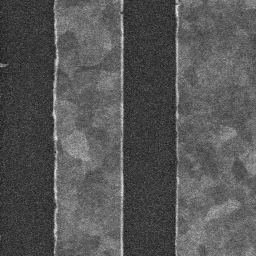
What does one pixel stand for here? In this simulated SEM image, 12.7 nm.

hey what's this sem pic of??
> one or a few lines or trenches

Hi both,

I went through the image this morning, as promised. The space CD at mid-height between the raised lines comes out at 707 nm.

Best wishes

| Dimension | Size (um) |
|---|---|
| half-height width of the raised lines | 0.84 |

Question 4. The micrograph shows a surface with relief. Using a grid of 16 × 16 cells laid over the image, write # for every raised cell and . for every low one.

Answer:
...#####...#####
...#####...#####
....####...#####
....####...#####
...#####...#####
...#####...#####
...#####...#####
...#####...#####
...#####...#####
....####...#####
...#####...#####
...#####...#####
....####...#####
...#####...#####
...#####...#####
...#####...#####